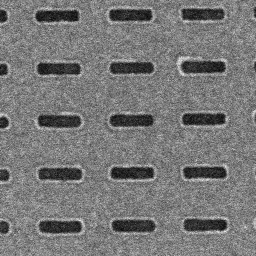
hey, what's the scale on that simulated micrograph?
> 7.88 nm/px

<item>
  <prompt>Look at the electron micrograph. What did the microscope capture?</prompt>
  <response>a regular array of holes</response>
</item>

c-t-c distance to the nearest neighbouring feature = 415 nm